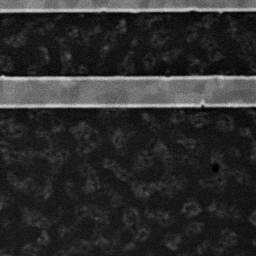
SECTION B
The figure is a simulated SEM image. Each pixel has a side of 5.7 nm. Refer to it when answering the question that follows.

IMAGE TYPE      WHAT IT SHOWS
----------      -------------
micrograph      one or a few lines or trenches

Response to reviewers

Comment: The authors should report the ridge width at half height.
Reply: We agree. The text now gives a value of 167 nanometers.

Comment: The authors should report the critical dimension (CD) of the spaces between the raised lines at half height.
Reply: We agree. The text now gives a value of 377 nm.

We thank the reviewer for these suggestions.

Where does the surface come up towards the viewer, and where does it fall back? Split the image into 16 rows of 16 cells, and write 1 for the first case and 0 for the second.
1111111111111111
0000000000000000
0000000000000000
0000000000000000
0000000000000000
1111111111111111
1111111111111111
0000000000000000
0000000000000000
0000000000000000
0000000000000000
0000000000000000
0000000000000000
0000000000000000
0000000000000000
0000000000000000